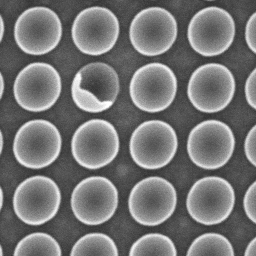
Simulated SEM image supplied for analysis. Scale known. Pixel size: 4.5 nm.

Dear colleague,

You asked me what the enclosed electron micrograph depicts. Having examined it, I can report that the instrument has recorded a regular array of raised bodies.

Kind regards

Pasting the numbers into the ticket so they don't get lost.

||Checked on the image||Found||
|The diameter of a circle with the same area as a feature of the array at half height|212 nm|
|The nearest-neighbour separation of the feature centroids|0.253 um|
